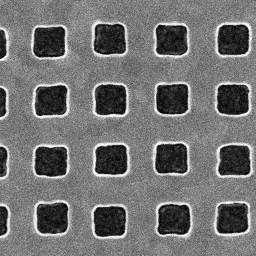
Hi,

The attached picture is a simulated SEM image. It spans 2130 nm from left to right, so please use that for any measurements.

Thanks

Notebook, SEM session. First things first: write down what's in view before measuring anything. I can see a regular array of holes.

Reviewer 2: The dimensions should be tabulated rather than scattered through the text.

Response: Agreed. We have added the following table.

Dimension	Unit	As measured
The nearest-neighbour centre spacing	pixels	59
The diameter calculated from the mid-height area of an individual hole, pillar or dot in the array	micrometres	0.291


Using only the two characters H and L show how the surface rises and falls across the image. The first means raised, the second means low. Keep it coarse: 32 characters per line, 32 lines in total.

HHHHHHHHHHHHHHHHHHHHHHHHHHHHHHHH
HHHHHHHHHHHHHHHHHHHHHHHHHHHHHHHH
HHHHHHHHHHHHHHHHHHHHHHHHHHHHHHHH
HHHHHLLLHHHHLLLLHHHHLLLHHHHLLLLH
LHHHLLLLHHHHLLLLHHHLLLLHHHHLLLLH
LHHHLLLLHHHHLLLLHHHLLLLLHHHLLLLH
LHHHLLLLHHHHLLLLHHHHLLLHHHHLLLLH
HHHHHHHHHHHHHHHHHHHHHHHHHHHHHHHH
HHHHHHHHHHHHHHHHHHHHHHHHHHHHHHHH
HHHHHHHHHHHHHHHHHHHHHHHHHHHHHHHH
HHHHHHHHHHHHHLLHHHHHLHLHHHHHHLHH
LHHHLLLLHHHHLLLLHHHHLLLLHHHLLLLH
LHHHLLLLHHHHLLLLHHHHLLLLHHHLLLLH
LHHHLLLLHHHHLLLLHHHHLLLLHHHLLLLH
LHHHHLLHHHHHHHHHHHHHHHHHHHHHHLHH
HHHHHHHHHHHHHHHHHHHHHHHHHHHHHHHH
HHHHHHHHHHHHHHHHHHHHHHHHHHHHHHHH
HHHHHHHHHHHHHHHHHHHHHHHHHHHHHHHH
LHHHHLLLHHHHLLLLHHHLLLLHHHHHLLLH
LHHHLLLLHHHHLLLLHHHLLLLLHHHLLLLH
LHHHLLLLLHHHLLLLHHHLLLLLHHHLLLLH
LHHHLLLLHHHHLLLLHHHHLLLHHHHLLLLH
HHHHHHHHHHHHHHHHHHHHHHHHHHHHHHHH
HHHHHHHHHHHHHHHHHHHHHHHHHHHHHHHH
HHHHHHHHHHHHHHHHHHHHHHHHHHHHHHHH
HHHHHLLLHHHHHHHHHHHHHLHHHHHHLLLH
LHHHLLLLLHHHLLLLHHHHLLLLHHHLLLLH
LHHHLLLLLHHHLLLLHHHHLLLLHHHLLLLH
LHHHHLLLHHHHLLLLHHHHLLLLHHHLLLLH
HHHHHHHHHHHHLLHHHHHHHHHHHHHHHHHH
HHHHHHHHHHHHHHHHHHHHHHHHHHHHHHHH
HHHHHHHHHHHHHHHHHHHHHHHHHHHHHHHH